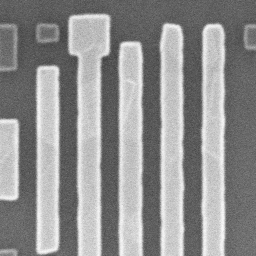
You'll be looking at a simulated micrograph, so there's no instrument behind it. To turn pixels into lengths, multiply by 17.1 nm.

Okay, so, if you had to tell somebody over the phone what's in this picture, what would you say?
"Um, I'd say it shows wiring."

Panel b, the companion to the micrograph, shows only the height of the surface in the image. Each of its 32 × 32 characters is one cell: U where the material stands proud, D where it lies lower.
DDDDDDDDDDDDDDDDDDDDDDDDDDDDDDDD
DDDDDDDDDDDDDDDDDDDDDDDDDDDDDDDD
DDDDDDDDDUUUUUDDDDDDDDDDDDDDDDDD
UUDDDUUDDUUUUUDDDDDDUUDDDDUUDDDU
UUDDDUUDDUUUUDDDDDDDUUUDDDUUDDDU
UUDDDDDDDUUUUDDUUDDDUUUDDDUUDDDU
UUDDDDDDDUUUUDDUUUDDUUUDDUUUDDDD
UUDDDDDDDDUUUDDUUUDDUUUDDUUUDDDD
UUDDDUUDDDUUUDDUUUDDUUUDDUUUDDDD
DDDDDUUDDDUUUDDUUUDDUUUDDDUUDDDD
DDDDDUUDDDUUDDDUUUDDUUUDDUUUDDDD
DDDDDUUDDDUUDDDUUUDDUUUDDUUUDDDD
DDDDDUUDDDUUUDDUUUDDUUUDDUUUDDDD
DDDDDUUDDDUUDDDUUUDDUUUDDDUUDDDD
DDDDDUUDDDUUDDDUUUDDUUUDDDUUDDDD
UUDDDUUDDDUUDDDUUUDDUUUDDUUUDDDD
UUDDDUUDDDUUUDDUUUDDUUUDDUUUDDDD
UUDDDUUDDDUUUDDUUUDDUUUDDUUUDDDD
UUDDDUUDDDUUUDDUUUDDUUUDDUUUDDDD
UUDDDUUDDDUUUDDUUUDDUUUDDUUUDDDD
UUDDDUUDDDUUDDDUUUDDUUUDDUUUDDDD
UUDDDUUDDDUUDDDUUUDDUUUDDUUUDDDD
UUDDDUUDDDUUDDDUUUDDUUUDDUUUDDDD
UUDDDUUDDDUUDDDUUUDDUUUDDUUUDDDD
UUDDDUUDDDUUDDDUUUDDUUUDDUUUDDDD
DDDDDUUDDDUUUDDUUUDDUUUDDUUUDDDD
DDDDDUUDDDUUUDDUUUDDUUUDDUUUDDDD
DDDDDUUDDDUUDDDUUUDDUUUDDUUUDDDD
DDDDDUUDDDUUDDDUUUDDUUUDDDUUDDDD
DDDDDUUDDDUUUDDUUUDDUUUDDDUUDDDD
DDDDDUUDDDUUUDDUUUDDUUUDDDUUDDDD
UUDDDUDDDDUUUDDUUUDDUUUDDUUUDDDD